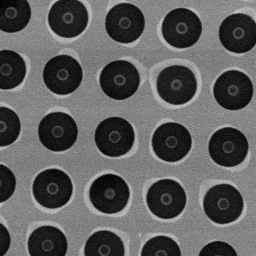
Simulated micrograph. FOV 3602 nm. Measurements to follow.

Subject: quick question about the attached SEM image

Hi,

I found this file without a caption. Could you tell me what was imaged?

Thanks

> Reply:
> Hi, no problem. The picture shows an array of small figures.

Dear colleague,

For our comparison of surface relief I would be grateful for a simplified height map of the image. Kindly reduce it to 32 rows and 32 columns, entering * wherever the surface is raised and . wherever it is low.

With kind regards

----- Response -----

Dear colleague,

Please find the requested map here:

....***....***..****************
....**.....**.....***...******.*
....**.....**.....**.....***....
...***.....**.....**.....**.....
*******...****....**.....**.....
***************..****...****....
..***************************..*
...***....*****.****************
....*.....***.....**....********
...**.....**......*......**....*
...***....**......*......**.....
******...****....**......**.....
********************....***....*
.***************************..**
..****...***********************
...**.....**....****..**********
...**.....**.....**.....***...**
..***.....**.....**.....**.....*
******...***.....**.....**.....*
*************...***....***.....*
***************************...**
..***...*****.******************
..**.....***....***...**********
..**.....**.....**.....***....**
.***.....**.....**.....**.....**
*****...***.....**.....**......*
************...****....***....**
********************..****....**
.***....************************
.**.....***....****..***********
.**.....***.....**....****...***
.**.....**......**.....**.....**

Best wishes